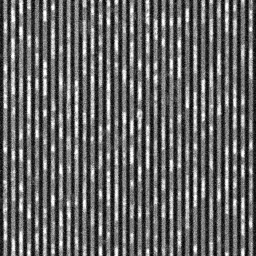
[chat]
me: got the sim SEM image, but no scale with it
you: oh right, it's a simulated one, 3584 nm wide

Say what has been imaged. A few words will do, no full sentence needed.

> parallel lines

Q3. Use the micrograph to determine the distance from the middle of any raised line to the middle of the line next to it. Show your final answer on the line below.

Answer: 0.111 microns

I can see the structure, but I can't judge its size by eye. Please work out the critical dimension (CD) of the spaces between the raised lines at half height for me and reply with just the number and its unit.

0.0752 um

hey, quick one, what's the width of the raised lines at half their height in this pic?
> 0.0385 micrometres